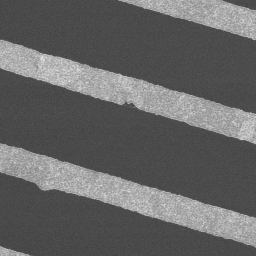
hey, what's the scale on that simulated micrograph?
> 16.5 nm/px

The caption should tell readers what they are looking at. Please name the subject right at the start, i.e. one or a few lines or trenches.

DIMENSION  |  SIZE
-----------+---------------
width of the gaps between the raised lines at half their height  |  1180 nm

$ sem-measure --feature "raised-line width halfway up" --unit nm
457